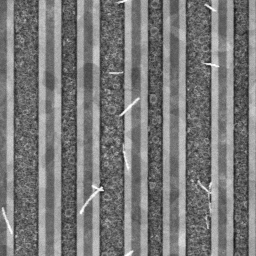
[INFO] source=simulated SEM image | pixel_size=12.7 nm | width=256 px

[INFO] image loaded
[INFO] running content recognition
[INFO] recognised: parallel lines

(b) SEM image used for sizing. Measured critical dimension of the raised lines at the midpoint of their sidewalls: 0.21 microns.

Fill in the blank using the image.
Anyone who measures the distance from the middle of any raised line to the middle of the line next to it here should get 548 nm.